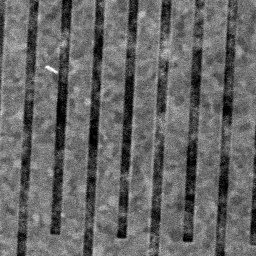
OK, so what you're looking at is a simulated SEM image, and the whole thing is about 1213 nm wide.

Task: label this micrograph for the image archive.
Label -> parallel lines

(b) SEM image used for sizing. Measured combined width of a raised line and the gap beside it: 157 nanometers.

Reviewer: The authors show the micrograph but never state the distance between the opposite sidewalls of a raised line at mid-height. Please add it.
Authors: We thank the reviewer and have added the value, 105 nanometers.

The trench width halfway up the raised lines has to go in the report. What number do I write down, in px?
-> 11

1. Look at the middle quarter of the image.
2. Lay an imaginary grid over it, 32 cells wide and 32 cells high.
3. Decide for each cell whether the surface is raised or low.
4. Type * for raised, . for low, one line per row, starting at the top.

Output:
.******...*****...*****...******
.******...*****...*****...******
.******...*****...*****...******
.******...*****...*****...*****.
.******...*****...*****...*****.
.******..******...*****...*****.
.******..******...*****...*****.
.******..******...*****...*****.
.******..******...*****...*****.
.******..******...*****...*****.
.*****...******...*****...*****.
.*****...*****...******...*****.
.*****...*****...******...*****.
.*****...*****...******...*****.
.*****...*****...******...*****.
.*****...*****...******...*****.
.*****...*****...******...*****.
.*****...*****...*****...******.
.*****...*****...*****...******.
******...*****...*****...******.
******...*****...*****...******.
******...*****...*****...******.
******...*****...*****...******.
******...*****...*****...*****..
******...*****...*****...*****..
******..******...*****...*****..
******..******...*****...*****..
******..******...*****...*****..
******..******...*****...*****..
******..******...*****...*****..
*****...******..******...*****..
*****...*****...******...*****..